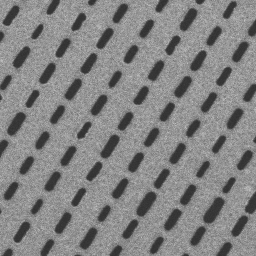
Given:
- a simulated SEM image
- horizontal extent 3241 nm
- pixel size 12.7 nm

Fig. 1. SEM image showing a regular array of holes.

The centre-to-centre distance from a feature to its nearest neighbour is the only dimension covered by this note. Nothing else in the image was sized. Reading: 375 nm